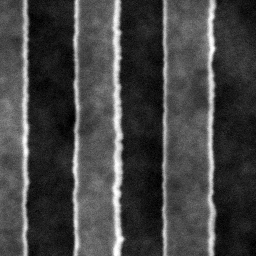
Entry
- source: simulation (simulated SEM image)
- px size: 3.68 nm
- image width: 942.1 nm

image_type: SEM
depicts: lines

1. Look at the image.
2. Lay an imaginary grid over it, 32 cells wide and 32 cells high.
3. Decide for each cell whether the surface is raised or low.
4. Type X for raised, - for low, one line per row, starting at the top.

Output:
XXX-------XXXXX------XXXXXX-----
XXX-------XXXXX------XXXXX------
XXX------XXXXXX------XXXXX------
XXX-------XXXXX------XXXXX------
XXX------XXXXXX------XXXXX------
XXX------XXXXXX-----XXXXXX------
XXX------XXXXXX------XXXXXX-----
XXX-------XXXXX------XXXXX------
XXX-------XXXXX------XXXXX------
XXX-------XXXXX------XXXXX------
XXX------XXXXXX------XXXXX------
XXX-------XXXXX------XXXXX------
XXX-------XXXXX------XXXXX------
XXX-------XXXXX------XXXXX------
XXX-------XXXXX------XXXXX------
XXX-------XXXXX-----XXXXXX------
XXX-------XXXXX------XXXXX------
XXX-------XXXXX-----XXXXXX------
XXX------XXXXXX------XXXXX------
XXX------XXXXXX------XXXXX------
XXX------XXXXXX-----XXXXXX------
XXX------XXXXXX-----XXXXXX------
XXX------XXXXXX-----XXXXXX------
XXX------XXXXXX-----XXXXXX------
XXX------XXXXXX-----XXXXXX------
XXX------XXXXXX-----XXXXXX------
XXX------XXXXXX-----XXXXXXX-----
XXX------XXXXXX-----XXXXXX------
XXX------XXXXXX-----XXXXXX------
XXX------XXXXXX-----XXXXXX------
XXX-------XXXXX------XXXXX------
XXX------XXXXXX------XXXXX------